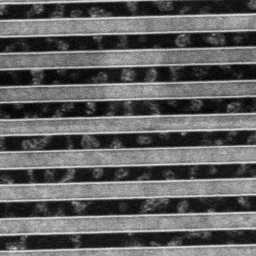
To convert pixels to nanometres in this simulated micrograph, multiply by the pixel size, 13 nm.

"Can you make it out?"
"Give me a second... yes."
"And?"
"parallel lines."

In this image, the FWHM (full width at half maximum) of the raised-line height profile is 228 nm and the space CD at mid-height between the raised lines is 194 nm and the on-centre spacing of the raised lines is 428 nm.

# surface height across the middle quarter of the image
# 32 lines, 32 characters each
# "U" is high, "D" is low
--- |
DDDDDDDDDDDDDDDDDDDDDDUUUUUUUUUU
UUUUUUUUUUUUUUUUUUUUUUUUUUUUUUUU
UUUUUUUUUUUUUUUDUUUUUDDUUUUUUUUU
UUUUUUUUUUUUUUUUUUUUUDUUUUUUUUUU
UUUUUUUUUUUUUUUUUUUUUUUUUUUUUDDD
DDDDDDDDDDDDDDDDDDDDDDDDDDDDDDDD
DDDDDDDDDDDDDDDDDDDDDDDDDDDDDDDD
DDDDDDDDDDDDDDDDDDDDDDDDDDDDDDDD
DDDDDDDDDDDDDDDDDDDDDDDDDDDDDDDD
UUUUUUUUUUUUUUUUUUUUUUUUUUUUUUUU
UUUUUUUUUUUUUUUUUUUUUUUUUUUUUUUU
UUUUUUUUUUUUUUUUUUUUUUUUUUUUUUUU
UUUUUUUUUUUUUUUUUUUUUUUUUUUUUUUU
UUUUDDDDDDDDDDDDDDDDDDDDDDDDDDDD
DDDDDDDDDDDDDDDDDDDDDDDDDDDDDDDD
DDDDDDDDDDDDDDDDDDDDDDDDDDDDDDDD
DDDDDDDDDDDDDDDDDDDDDDDDDDDDDDDD
DDDUUUUUUUUUUUUUUUUUUUUUUUUUUUUU
UUUUUUUUUUUUUUUUUUUUUUUUUUUUUUUU
UUUUUDUUUUUUUUUUUUUUUUUUUUUUUUUU
UUUUUUUUUUUUUUUUUUUUUUUUUUUUUUUU
UUUUUDDUDDDDDDDDDDDDDDDDDDDDDDDD
DDDDDDDDDDDDDDDDDDDDDDDDDDDDDDDD
DDDDDDDDDDDDDDDDDDDDDDDDDDDDDDDD
DDDDDDDDDDDDDDDDDDDDDDDDDDDDDDDD
DDDDDDDDDDDDDDDDDUUUUUUUUUUUUUUU
UUUUUUUUUUUUUUUUUUUUUUUUUUUUUUUU
UUUUUUUDDUUUUUUUUUUUUUUUUUUUUUUU
UUUUUUUUUUUUUUUUUUUUUUUUUUUUUUUU
UUUUUUUUUUUUUUUDDDDDDDDDDDDDDDDD
DDDDDDDDDDDDDDDDDDDDDDDDDDDDDDDD
DDDDDDDDDDDDDDDDDDDDDDDDDDDDDDDD